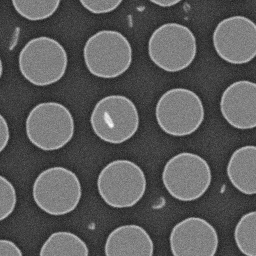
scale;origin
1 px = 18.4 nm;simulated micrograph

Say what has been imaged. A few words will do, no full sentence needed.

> an array of small figures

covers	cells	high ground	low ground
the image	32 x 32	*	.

..*****...*****.....**..........
..*****.....*...................
............................***.
....................***....*****
............***....*****...*****
....***....*****...*****...*****
...*****...*****...*****...*****
..******...*****...*****....***.
...*****...*****....***.........
...*****.....*..................
....**.......................***
.....................***....****
.............***....*****...****
....****....*****...*****...****
....*****...*****...*****...****
*..******..******...*****....***
*..******...*****....***........
*...*****....***................
.....**.......................**
......................***....***
..............***....*****...***
......***....*****...*****...***
*....*****..******..******...***
**..******..******...*****....**
**..******...*****....***.......
**...*****....***...............
*.....**........................
.......................**.....**
...............***....*****...**
......***.....****...******..***
**....****...******..******...**
**...******..******...*****...**